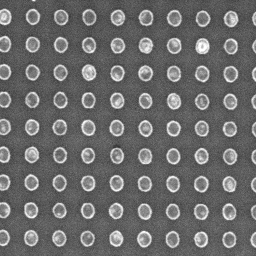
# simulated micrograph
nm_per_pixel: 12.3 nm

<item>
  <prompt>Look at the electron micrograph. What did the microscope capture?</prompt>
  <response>a regular array of raised bodies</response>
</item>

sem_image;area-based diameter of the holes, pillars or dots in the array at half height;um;0.168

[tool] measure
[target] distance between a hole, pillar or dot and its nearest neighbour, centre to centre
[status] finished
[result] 338 nm